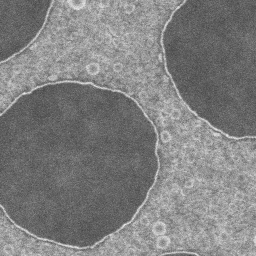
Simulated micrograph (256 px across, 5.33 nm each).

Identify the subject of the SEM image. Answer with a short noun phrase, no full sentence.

raised bodies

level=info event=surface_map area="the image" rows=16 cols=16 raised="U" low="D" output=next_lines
UUUDDDDDDDDUUUUU
UUUDDDDDDDUUUUUU
UUDDDDDDDDUUUUUU
UDDDDDDDDDUUUUUU
DDDDDDDDDDUUUUUU
DDUUUUDDDDDUUUUU
DUUUUUUUUDDDUUUU
UUUUUUUUUDDDDUUU
UUUUUUUUUUDDDDUU
UUUUUUUUUUDDDDDD
UUUUUUUUUUDDDDDD
UUUUUUUUUUDDDDDD
UUUUUUUUUDDDDDDD
UUUUUUUUDDDDDDDD
DDUUUUUDDDDDDDDD
DDDDDDDDDDDDDDDD